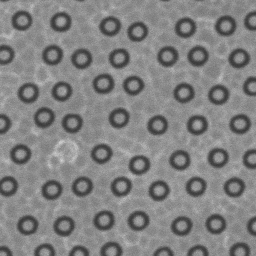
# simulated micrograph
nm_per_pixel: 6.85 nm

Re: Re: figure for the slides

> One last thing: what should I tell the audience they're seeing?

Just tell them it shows a regular array of ring-shaped grooves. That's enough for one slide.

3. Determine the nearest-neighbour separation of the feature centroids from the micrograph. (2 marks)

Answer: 223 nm